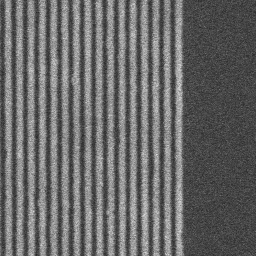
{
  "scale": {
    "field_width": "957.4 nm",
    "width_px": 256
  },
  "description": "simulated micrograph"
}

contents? parallel lines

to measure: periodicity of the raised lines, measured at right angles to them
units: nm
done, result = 42.4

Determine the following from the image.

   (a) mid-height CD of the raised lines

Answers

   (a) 23.4 nanometres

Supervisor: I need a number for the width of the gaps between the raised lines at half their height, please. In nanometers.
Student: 20.1